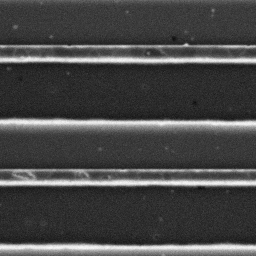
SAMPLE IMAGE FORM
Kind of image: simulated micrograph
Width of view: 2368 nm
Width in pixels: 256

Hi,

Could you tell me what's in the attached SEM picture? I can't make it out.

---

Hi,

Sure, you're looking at lines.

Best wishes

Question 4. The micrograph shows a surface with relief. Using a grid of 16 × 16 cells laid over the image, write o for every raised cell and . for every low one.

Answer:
oooooooooooooooo
oooooooooooooooo
oooooooooooooooo
oooooooooooooooo
................
................
................
................
oooooooooooooooo
oooooooooooooooo
oooooooooooooooo
................
................
................
................
oooooooo......o.